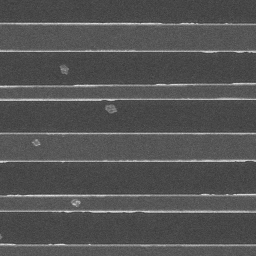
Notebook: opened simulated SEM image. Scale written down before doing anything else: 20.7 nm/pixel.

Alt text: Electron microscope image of lines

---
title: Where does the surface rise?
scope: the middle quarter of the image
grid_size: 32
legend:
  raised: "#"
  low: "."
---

................................
................................
................................
................................
................................
....############################
################################
################################
################################
................................
................................
................................
................................
................................
................................
................................
................................
################################
################################
################################
################################
################################
################################
################################
................................
................................
................................
................................
................................
................................
................................
................................